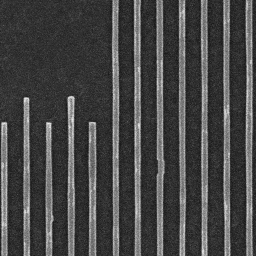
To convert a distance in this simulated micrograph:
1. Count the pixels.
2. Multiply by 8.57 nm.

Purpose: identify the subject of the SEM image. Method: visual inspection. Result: parallel lines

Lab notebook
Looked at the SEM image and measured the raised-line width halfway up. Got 0.0493 um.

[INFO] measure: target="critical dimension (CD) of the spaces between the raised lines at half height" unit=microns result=0.149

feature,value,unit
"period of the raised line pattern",191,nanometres